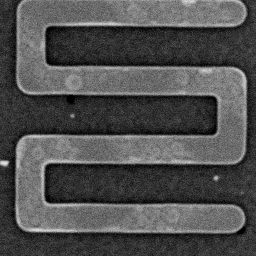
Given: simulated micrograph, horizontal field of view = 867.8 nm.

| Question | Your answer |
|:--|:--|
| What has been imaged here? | groups of lines, slits or small figures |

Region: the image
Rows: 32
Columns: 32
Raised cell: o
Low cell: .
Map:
...ooooooooooooooooooooooooooo..
..ooooooooooooooooooooooooooooo.
..oooooooooooooooooooooooooooo..
..oooo..........................
..oooo..........................
..oooo..........................
..oooo..........................
..oooo..........................
..oooooooooooooooooooooo........
..ooooooooooooooooooooooooooooo.
..ooooooooooooooooooooooooooooo.
...oooooooooooooooooooooooooooo.
...........................oooo.
...........................oooo.
...........................oooo.
...........................oooo.
...........................oooo.
...oooooooooooooooooooooooooooo.
..ooooooooooooooooooooooooooooo.
..oooooooooooooooooooooooooooo..
...ooo..........................
..ooo...........................
..ooo...........................
..ooo...........................
..ooo...........................
..oooo..........................
..oooooooooooooooooooooooooooo..
..ooooooooooooooooooooooooooooo.
...o.ooooooooooooooooooooooooo..
................................
................................
................................